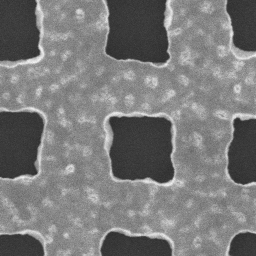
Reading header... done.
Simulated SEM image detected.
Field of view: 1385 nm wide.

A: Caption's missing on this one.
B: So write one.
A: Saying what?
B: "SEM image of holes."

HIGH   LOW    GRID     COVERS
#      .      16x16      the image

..#####...####..
...####...####..
..#####....####.
..#####...######
################
################
################
...####....####.
...####....####.
..#####....###..
..#####....###..
################
################
################
###############.
...###.....###..